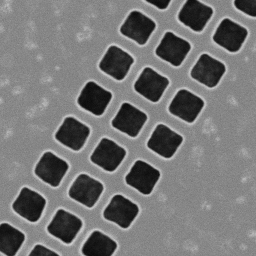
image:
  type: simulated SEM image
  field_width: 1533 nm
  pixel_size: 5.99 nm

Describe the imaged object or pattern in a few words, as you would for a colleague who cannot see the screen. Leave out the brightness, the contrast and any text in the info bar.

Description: a regular array of holes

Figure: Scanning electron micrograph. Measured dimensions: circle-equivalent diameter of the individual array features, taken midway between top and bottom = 188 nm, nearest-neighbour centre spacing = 246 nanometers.